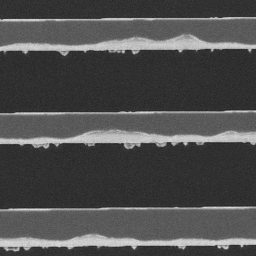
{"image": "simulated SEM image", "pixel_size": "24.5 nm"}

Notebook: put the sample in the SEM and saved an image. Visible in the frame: lines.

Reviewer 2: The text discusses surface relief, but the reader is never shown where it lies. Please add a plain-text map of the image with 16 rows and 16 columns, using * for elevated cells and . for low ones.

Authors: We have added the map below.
................
****************
****************
................
................
................
................
****************
****************
................
................
................
................
****************
****************
................